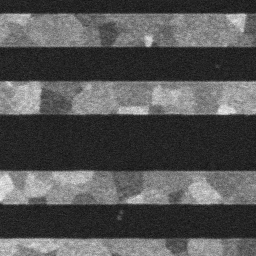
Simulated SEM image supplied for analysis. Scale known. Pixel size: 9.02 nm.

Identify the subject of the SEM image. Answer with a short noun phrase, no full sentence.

wiring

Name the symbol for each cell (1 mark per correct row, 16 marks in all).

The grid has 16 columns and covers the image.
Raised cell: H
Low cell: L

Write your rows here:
LLLLLLLLLLLLLLLL
HHHHHHHHHHHHHHHH
HHHHHHHHHHHHHHHH
LLLLLLLLLLLLLLLL
LLLLLLLLLLLLLLLL
HHHHHHHHHHHHHHHH
HHHHHHHHHHHHHHHH
LLLLLLLLLLLLLLLL
LLLLLLLLLLLLLLLL
LLLLLLLLLLLLLLLL
LLLLLLLLLLLLLLLL
HHHHHHHHHHHHHHHH
HHHHHHHHHHHHHHHH
LLLLLLLLLLLLLLLL
LLLLLLLLLLLLLLLL
HHHHHHHHHHHHHHHH